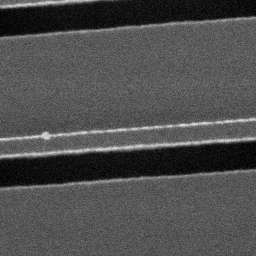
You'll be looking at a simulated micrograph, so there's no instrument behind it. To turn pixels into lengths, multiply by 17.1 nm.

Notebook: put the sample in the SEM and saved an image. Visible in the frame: lines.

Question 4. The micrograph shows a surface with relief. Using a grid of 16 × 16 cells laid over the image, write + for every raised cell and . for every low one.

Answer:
................
...........+++++
++++++++++++++++
++++++++++++++++
++++++++++++++++
++++++++++++++++
++++++++++++++++
++++++++++++++++
++++++++++++++++
+++++...........
................
....++++++++++++
++++++++++++++++
++++++++++++++++
++++++++++++++++
++++++++++++++++